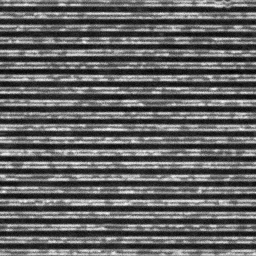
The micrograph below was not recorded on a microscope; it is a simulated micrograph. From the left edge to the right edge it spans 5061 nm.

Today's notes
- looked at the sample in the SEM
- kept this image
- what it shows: parallel lines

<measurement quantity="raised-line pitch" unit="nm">247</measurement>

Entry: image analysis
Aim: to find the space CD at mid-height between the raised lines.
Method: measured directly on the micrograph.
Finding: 151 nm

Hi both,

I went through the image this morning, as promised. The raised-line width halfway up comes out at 0.101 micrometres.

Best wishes